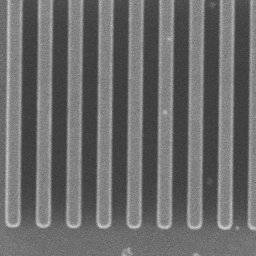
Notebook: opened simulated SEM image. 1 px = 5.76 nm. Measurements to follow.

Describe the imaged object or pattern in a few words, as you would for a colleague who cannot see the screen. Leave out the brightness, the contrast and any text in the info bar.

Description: groups of lines, slits or small figures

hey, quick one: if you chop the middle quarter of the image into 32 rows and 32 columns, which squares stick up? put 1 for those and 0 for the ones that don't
01110000011100001111000011100001
01110000011100001110000011100001
01110000011100001110000011100001
01110000011100001110000011100001
01110000011100001110000011100001
01110000011100001110000011100001
01110000011100001110000011100001
01110000011100001110000011100001
01110000011100001110000011100001
01110000011100001110000011100001
01110000011100001110000011100001
01110000011100001110000011100001
01110000011100001110000011100001
01110000011100001110000011100001
01110000011100001110000011100001
01110000011100001110000011100001
01110000011100001110000011100001
01110000011100001110000011100001
01110000011100001110000011100001
01110000011100001110000011100001
01110000011100001110000011100001
01110000011100001110000011100001
01110000011100001110000011100001
01110000011100001110000011100001
01110000011100001110000011100001
01110000011100001110000011100001
01110000111100001110000011100001
01110000111100001110000011100001
01110000111100001110000011100001
01110000111100001110000011100001
01110000111100001110000011100001
01110000111100001110000011100001